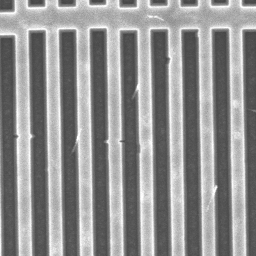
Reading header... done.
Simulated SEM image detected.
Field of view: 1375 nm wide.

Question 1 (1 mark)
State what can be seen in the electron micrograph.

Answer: parallel lines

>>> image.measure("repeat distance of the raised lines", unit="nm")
164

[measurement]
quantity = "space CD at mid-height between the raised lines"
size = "81.9 nm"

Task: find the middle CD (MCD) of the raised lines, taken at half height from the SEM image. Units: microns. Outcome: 0.0812